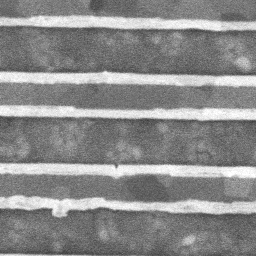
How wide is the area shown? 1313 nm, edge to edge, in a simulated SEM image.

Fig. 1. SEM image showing one or a few lines or trenches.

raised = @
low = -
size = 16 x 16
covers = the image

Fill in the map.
@@@@@@@@@@@@@@@@
---------@---@@@
----------------
----------------
----------------
@@@@@@@@@@@@@@@@
@@@@@@@@@@@@@@@@
----------------
----------------
----------------
@@--------------
@@@@@@@@@@@@@@@@
@@@@@@@@@@@@@@@@
----------------
----------------
----------------